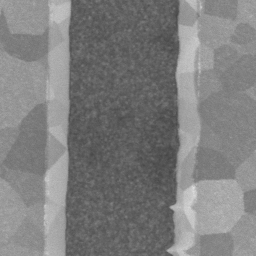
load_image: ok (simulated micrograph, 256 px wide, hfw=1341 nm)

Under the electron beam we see one or a few lines or trenches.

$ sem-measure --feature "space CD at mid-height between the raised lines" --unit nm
686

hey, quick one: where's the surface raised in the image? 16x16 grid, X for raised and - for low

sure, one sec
XXXX--------XXXX
XXXX--------XXXX
XXXX--------XXXX
XXXX--------XXXX
XXXX--------XXXX
XXXX--------XXXX
XXXX--------XXXX
XXXX--------XXXX
XXXX--------XXXX
XXXX--------XXXX
XXX---------XXXX
XXX---------XXXX
XXX---------XXXX
XXX---------XXXX
XXX---------XXXX
XXX--------XXXXX